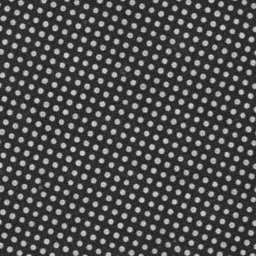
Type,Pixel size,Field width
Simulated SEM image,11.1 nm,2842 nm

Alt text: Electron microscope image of a regular array of raised bodies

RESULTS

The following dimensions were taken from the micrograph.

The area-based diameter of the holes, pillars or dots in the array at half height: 56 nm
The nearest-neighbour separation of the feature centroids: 113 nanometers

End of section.